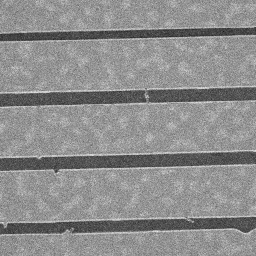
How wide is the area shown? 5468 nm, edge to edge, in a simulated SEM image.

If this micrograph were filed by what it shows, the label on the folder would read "one or a few lines or trenches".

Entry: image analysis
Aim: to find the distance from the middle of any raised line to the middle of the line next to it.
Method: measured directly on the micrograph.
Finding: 1380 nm